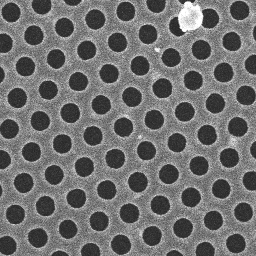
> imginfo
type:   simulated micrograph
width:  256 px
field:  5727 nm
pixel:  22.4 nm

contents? a regular array of holes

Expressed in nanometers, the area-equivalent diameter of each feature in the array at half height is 445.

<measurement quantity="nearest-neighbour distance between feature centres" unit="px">31.4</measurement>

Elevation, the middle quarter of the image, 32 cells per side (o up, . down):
oooooooooo...oooo.....oooo..oooo
ooooooooo.....ooo....ooooooooooo
oo...oooo.....oooo...ooooooooo..
o.....ooo.....oooooooooooooooo..
o.....oooo...oooooooooo....ooo..
o.....oooooooooooooooo.....ooo..
oo...oooooooooo....ooo.....ooooo
ooooooooooooooo....oooo....ooooo
oooooooo...oooo.....ooo..ooooooo
ooooooo.....ooo....ooooooooooo.o
...oooo.....oooo..oooooooooo....
....ooo....ooooooooooo.ooooo....
....oooo..oooooooooo.....ooo....
....oooooooooo..oooo.....ooo....
...oooooooooo....ooo.....ooooooo
ooooooo.oooo.....oooo....ooooooo
ooooo....oooo....ooooooooooooooo
ooooo.....ooo....oooooooooo..ooo
..ooo.....oooooooooooooooo....oo
..ooo....oooooooooo...oooo.....o
..oooooooooooooooo.....ooo.....o
.ooooooooooo..oooo.....oooo...oo
ooooooooooo....ooo.....ooooooooo
oooo..oooo.....oooo...oooooooooo
ooo....ooo.....ooooooooooooooooo
ooo....oooo....oooooooooo...ooo.
ooo.....oooooooooooooooo.....ooo
ooo....oooooooooo...oooo.....ooo
oooooooooooooooo.....ooo.....ooo
ooooooooo...oooo.....oooo...oooo
oooooooo.....ooo.....ooooooooooo
oo...ooo.....oooo...oooooooooo..